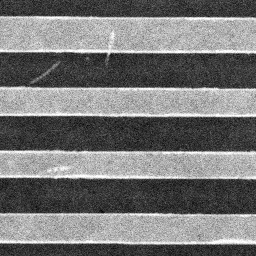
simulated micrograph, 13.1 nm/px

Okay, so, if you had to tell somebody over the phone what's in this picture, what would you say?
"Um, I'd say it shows lines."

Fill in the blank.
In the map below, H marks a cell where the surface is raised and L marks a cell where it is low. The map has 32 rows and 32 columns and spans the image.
LLLLLLLLLLLLLLLLLLLLLLLLLLLLLLLL
LLLLLLLLLLLLLLLLLLLLLLLLLLLLLLLL
HHHHHHHHHHHHHHHHHHHHHHHHHHHHHHHH
HHHHHHHHHHHHHHHHHHHHHHHHHHHHHHHH
HHHHHHHHHHHHHHHHHHHHHHHHHHHHHHHH
HHHHHHHHHHHHHHHHHHHHHHHHHHHHHHHH
LLLLLLLLLLLHHHHHHHHHHHHHHHHHHHHH
LLLLLLLLLLLLLLLLLLLLLLLLLLLLLLLL
LLLLLLLLLLLLLLLLLLLLLLLLLLLLLLLL
LLLLLLLLLLLLLLLLLLLLLLLLLLLLLLLL
LLLLLLLLLLLLLLLLLLLLLLLLLLLLLLLL
HHHHHHHHHHHHHHHHHHHHHHHHHHHHHHHH
HHHHHHHHHHHHHHHHHHHHHHHHHHHHHHHH
HHHHHHHHHHHHHHHHHHHHHHHHHHHHHHHH
LLLLLLLLLLLLLLHLLHHHHHHHHHHHHHHH
LLLLLLLLLLLLLLLLLLLLLLLLLLLLLLLL
LLLLLLLLLLLLLLLLLLLLLLLLLLLLLLLL
LLLLLLLLLLLLLLLLLLLLLLLLLLLLLLLL
LLLLLLLLLLLLLLLLLLLLLLLLLLLLLLLL
HHHHHHHHHHHHHHHHHHHHHHHHHHHHHHHH
HHHHHHHHHHHHHHHHHHHHHHHHHHHHHHHH
HHHHHHHHHHHHHHHHHHHHHHHHHHHHHHHH
LLLLLLLLLLLLLLLLLLLLLLLLLLLLLLLL
LLLLLLLLLLLLLLLLLLLLLLLLLLLLLLLL
LLLLLLLLLLLLLLLLLLLLLLLLLLLLLLLL
LLLLLLLLLLLLLLLLLLLLLLLLLLLLLLLL
LLLLLLLLLLLLLLLLLLLLLLLLLLLLLLLL
HHHHHHHHHHHHHHHHHHHHHHHHHHHHHHHH
HHHHHHHHHHHHHHHHHHHHHHHHHHHHHHHH
HHHHHHHHHHHHHHHHHHHHHHHHHHHHHHHH
LLLLLLLLLLLLLLLLLLLLLLLLLLLLLLLL
LLLLLLLLLLLLLLLLLLLLLLLLLLLLLLLL